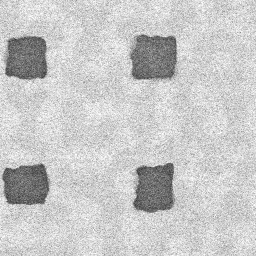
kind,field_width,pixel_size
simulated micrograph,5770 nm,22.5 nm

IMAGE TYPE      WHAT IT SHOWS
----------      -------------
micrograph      holes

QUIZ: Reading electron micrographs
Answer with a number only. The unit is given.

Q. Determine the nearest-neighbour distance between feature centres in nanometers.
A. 2860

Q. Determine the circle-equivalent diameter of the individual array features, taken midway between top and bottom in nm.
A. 1040